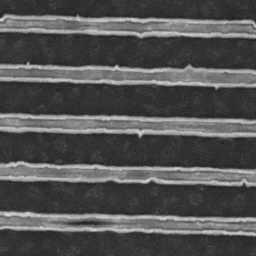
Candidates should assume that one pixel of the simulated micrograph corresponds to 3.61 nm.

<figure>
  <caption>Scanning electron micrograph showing parallel lines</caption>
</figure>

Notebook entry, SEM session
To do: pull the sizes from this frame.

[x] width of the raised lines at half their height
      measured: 52.7 nanometres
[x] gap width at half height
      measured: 123 nanometres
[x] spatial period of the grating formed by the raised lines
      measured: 178 nm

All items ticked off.